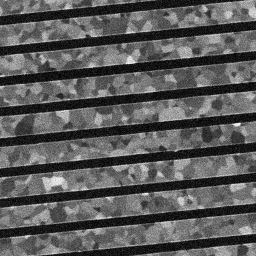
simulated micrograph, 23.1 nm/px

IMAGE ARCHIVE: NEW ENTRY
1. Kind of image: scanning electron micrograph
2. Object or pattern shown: parallel lines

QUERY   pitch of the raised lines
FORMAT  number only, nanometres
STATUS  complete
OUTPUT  701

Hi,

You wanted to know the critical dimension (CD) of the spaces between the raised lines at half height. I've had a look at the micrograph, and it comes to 222 nm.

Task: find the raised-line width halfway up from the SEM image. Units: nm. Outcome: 475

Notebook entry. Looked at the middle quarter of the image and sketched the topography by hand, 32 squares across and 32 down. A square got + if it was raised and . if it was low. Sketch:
++++++++++......................
.........................+++++++
...............+++++++++++++++++
.......+++++++++++++++++++++++++
++++++++++++++++++++++++++++++++
++++++++++++++++++++++++++++++++
+++++++++++++++++++++++++.......
++++++++++++++++................
+++++.........................++
......................++++++++++
............++++++++++++++++++++
..++++++++++++++++++++++++++++++
++++++++++++++++++++++++++++++++
++++++++++++++++++++++++++++++++
+++++++++++++++++++++++.........
+++++++++++.....................
+++.........................++++
..................++++++++++++++
........++++++++++++++++++++++++
++++++++++++++++++++++++++++++++
++++++++++++++++++++++++++++++++
+++++++++++++++++++++++++++++...
++++++++++++++++++..............
++++++++........................
........................++++++++
..............++++++++++++++++++
....++++++++++++++++++++++++++++
++++++++++++++++++++++++++++++++
++++++++++++++++++++++++++++++++
+++++++++++++++++++++++.........
+++++++++++++...................
+++++.........................++